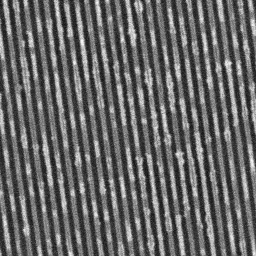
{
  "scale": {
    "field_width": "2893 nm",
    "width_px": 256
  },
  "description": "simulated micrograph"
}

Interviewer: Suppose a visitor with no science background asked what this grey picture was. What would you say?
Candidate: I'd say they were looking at parallel lines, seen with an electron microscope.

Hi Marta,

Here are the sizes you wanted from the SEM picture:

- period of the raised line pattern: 114 nanometers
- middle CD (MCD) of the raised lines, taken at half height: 0.0335 micrometres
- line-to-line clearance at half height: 75.6 nanometers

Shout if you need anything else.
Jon